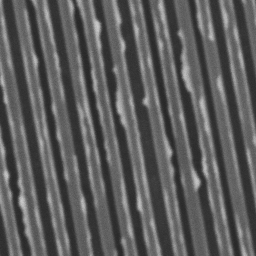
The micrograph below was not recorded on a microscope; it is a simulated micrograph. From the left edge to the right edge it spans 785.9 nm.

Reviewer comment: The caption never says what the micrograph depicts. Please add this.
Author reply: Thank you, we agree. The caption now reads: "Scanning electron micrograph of parallel lines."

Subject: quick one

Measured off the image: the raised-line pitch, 69.8 nm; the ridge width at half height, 0.0389 µm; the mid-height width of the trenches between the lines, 30.3 nm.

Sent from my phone